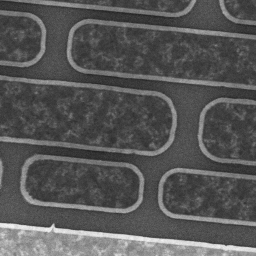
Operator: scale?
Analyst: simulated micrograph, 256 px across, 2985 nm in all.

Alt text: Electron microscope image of one or a few lines or trenches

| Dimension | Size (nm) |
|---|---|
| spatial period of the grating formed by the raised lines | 805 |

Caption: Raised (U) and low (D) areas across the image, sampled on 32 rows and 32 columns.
DDDDDDDUUUUUUUUUUUUUUUUUDDDDUUUU
DDDDDDDDDDDDDDDDDUUUUUUDDDDDUUUU
UUUUUDDDDDDDDDDDDDDDDDDDDDDDDUUU
UUUUUDDDDUUUUUUUUUUUDDDDDDDDDDDD
UUUUUDDDDUUUUUUUUUUUUUUUUUUUUUDD
UUUUUDDDDUUUUUUUUUUUUUUUUUUUUUUU
UUUUUDDDDUUUUUUUUUUUUUUUUUUUUUUU
UUUUDDDDDUUUUUUUUUUUUUUUUUUUUUUU
DDDDDDDDDDUUUUUUUUUUUUUUUUUUUUUU
DDDDDDDDDDDDDDDDUUUUUUUUUUUUUUUU
UUUUUUUUDDDDDDDDDDDDDDDDDDDUUUUU
UUUUUUUUUUUUUUUUUDDDDDDDDDDDDDDD
UUUUUUUUUUUUUUUUUUUUUDDDDDDDDDDD
UUUUUUUUUUUUUUUUUUUUUUDDDDUUUUUU
UUUUUUUUUUUUUUUUUUUUUUDDDUUUUUUU
UUUUUUUUUUUUUUUUUUUUUUDDDUUUUUUU
UUUUUUUUUUUUUUUUUUUUUUDDDUUUUUUU
DDUUUUUUUUUUUUUUUUUUUDDDDUUUUUUU
DDDDDDDDDDDUUUUUUUUUUDDDDUUUUUUU
DDDDDDDDDDDDDDDDDDDDDDDDDDUUUUUU
DDDUUUUUUUUUUUDDDDDDDDDDDDDDDDDD
DDDUUUUUUUUUUUUUUDDDDUUUDDDDDDDD
DDDUUUUUUUUUUUUUUUDDUUUUUUUUUUUU
DDDUUUUUUUUUUUUUUUDDUUUUUUUUUUUU
DDDUUUUUUUUUUUUUUUDDUUUUUUUUUUUU
DDDDDDUUUUUUUUUUUDDDUUUUUUUUUUUU
DDDDDDDDDDDDDDDDDDDDDUUUUUUUUUUU
DDDDDDDDDDDDDDDDDDDDDDDDDDUUUUUU
UUUUDDDDDDDDDDDDDDDDDDDDDDDDDDDD
UUUUUUUUUUUUUUDDDDDDDDDDDDDDDDDD
UUUUUUUUUUUUUUUUUUUUUUUUUDDDDDDD
UUUUUUUUUUUUUUUUUUUUUUUUUUUUUUUU